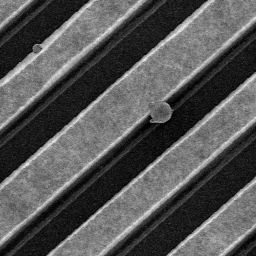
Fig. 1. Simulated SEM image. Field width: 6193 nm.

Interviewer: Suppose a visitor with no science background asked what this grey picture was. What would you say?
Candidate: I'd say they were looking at lines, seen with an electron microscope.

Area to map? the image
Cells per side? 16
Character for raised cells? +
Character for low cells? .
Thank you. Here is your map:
+....++++....+++
....+++....+++++
...+++....+++++.
..+++....++++...
.+++....++++....
+++....++++....+
++....+++++...++
+....++++....+++
...+++++....+++.
..+++++...++++..
.+++++...++++...
++++....+++.....
+++....+++....++
++....+++....+++
+....+++....++++
...++++....++++.